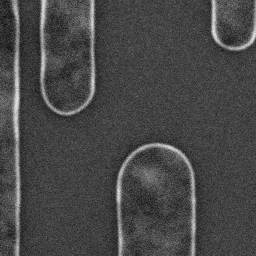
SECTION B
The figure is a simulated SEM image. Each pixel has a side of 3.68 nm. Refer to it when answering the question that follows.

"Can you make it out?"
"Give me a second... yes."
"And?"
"groups of lines, slits or small figures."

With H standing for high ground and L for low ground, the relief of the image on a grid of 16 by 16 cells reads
HLLHHHLLLLLLLHHH
HLLHHHLLLLLLLHHH
HLLHHHLLLLLLLLHH
HLLHHHLLLLLLLLLL
HLLHHHLLLLLLLLLL
HLLHHHLLLLLLLLLL
HLLHHLLLLLLLLLLL
HLLLLLLLLLLLLLLL
HLLLLLLLLLLLLLLL
HLLLLLLLHHHLLLLL
HLLLLLLLHHHHLLLL
HLLLLLLHHHHHLLLL
HLLLLLLHHHHHLLLL
HLLLLLLHHHHHLLLL
HLLLLLLHHHHHLLLL
HLLLLLLHHHHHLLLL